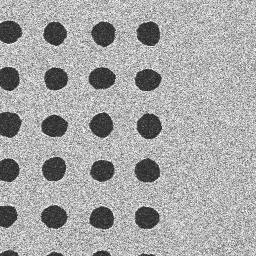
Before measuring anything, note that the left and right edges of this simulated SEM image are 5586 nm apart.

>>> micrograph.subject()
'a regular array of holes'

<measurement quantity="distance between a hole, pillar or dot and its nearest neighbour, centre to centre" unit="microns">0.986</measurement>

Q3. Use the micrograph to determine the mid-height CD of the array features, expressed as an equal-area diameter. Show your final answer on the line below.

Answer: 532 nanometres